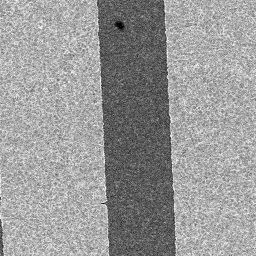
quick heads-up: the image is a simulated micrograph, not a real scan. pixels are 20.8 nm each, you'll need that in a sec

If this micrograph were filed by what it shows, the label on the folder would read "one or a few lines or trenches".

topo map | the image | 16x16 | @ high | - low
@@@@@@----@@@@@@
@@@@@@----@@@@@@
@@@@@@----@@@@@@
@@@@@@----@@@@@@
@@@@@@----@@@@@@
@@@@@@-----@@@@@
@@@@@@-----@@@@@
@@@@@@-----@@@@@
@@@@@@-----@@@@@
@@@@@@@----@@@@@
@@@@@@@----@@@@@
@@@@@@@----@@@@@
@@@@@@@----@@@@@
@@@@@@@----@@@@@
@@@@@@@----@@@@@
@@@@@@@----@@@@@